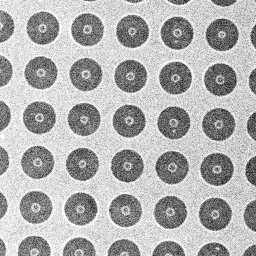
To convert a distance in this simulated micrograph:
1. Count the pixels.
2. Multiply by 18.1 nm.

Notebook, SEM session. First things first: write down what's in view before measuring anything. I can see an array of small figures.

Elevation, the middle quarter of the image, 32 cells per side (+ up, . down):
++.......++++.......+++++......+
+.........+++........+++........
+....+....++....+....+++........
+.........++....+....++....++...
++.......++++........+++........
++.......++++.......++++........
++++...+++++++.....++++++......+
++++++++++++++++++++++++++...+++
++++++++++++++++++++++++++++++++
++++++++++++++++++++++++++++++++
++......++++++....+++++++++.++++
+........++++.......+++++.....++
+........+++........++++.......+
+........+++.........++.........
+........+++....+....++....+....
+........+++........+++....+....
++......+++++.......++++.......+
+++....++++++......+++++.......+
+++++++++++++++..+++++++++....++
++++++++++++++++++++++++++++++++
++++++++++++++++++++++++++++++++
++.....+++++++...+++++++++++++++
+.......+++++......+++++......++
+........+++........+++........+
....+....+++........+++........+
....+....++....++...+++...++...+
+........+++........+++...++...+
+.......++++........+++........+
++.....++++++......+++++......++
++++++++++++++...++++++++....+++
++++++++++++++++++++++++++++++++
++++++++++++++++++++++++++++++++